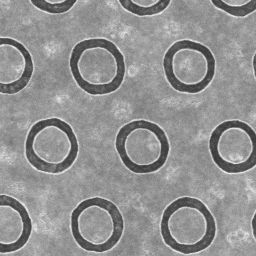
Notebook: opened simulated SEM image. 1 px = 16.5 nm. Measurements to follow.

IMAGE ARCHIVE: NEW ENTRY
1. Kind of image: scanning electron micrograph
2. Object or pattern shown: ring-shaped grooves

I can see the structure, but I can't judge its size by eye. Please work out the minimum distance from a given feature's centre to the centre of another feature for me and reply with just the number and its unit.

1490 nanometres